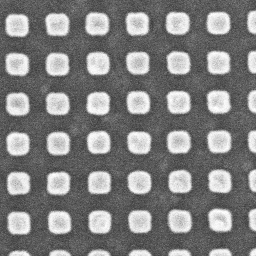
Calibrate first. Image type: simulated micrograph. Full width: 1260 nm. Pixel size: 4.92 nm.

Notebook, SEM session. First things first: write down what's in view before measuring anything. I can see a regular array of raised bodies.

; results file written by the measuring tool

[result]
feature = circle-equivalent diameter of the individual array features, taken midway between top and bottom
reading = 112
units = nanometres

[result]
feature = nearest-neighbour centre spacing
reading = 194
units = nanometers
